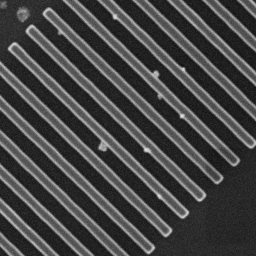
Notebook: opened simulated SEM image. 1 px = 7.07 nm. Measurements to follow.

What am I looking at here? groups of lines, slits or small figures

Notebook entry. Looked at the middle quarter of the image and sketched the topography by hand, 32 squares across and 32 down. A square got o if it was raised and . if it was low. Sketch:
oo......ooo......ooo.....oooo...
ooo......ooo......ooo.....oooo..
.ooo......ooo......ooo.....oooo.
..oooo.....oooo.....ooo......ooo
...oooo.....oooo.....ooo......oo
....oooo.....oooo.....ooo......o
.....oooo.....ooo......ooo......
o.....oooo.....ooo......ooo.....
oo.....oooo.....ooo......ooo....
ooo.....oooo.....oooo.....ooo...
.ooo.....oooo.....oooo.....ooo..
..ooo.....oooo.....oooo.....oooo
...ooo.....oooo.....oooo.....ooo
....ooo.....oooo.....oooo.....oo
.....ooo.....oooo.....oooo.....o
o.....ooo......ooo.....oooo.....
o......ooo......ooo.....oooo....
oo......ooo......ooo.....oooo...
ooo......ooo.....oooo.....oooo..
.oooo.....ooo......ooo.....oooo.
..oooo.....ooo......ooo......ooo
...oooo.....ooo.....oooo.....ooo
....oooo.....ooo......ooo.....oo
.....oooo.....ooo......ooo.....o
o.....oooo.....ooo......ooo.....
oo.....oooo.....ooo......ooo....
ooo.....oooo.....ooo......ooo...
.ooo.....oooo.....oooo.....ooo..
..ooo.....oooo.....oooo.....ooo.
...ooo.....oooo.....oooo.....ooo
....ooo.....oooo.....oooo.....oo
.....ooo.....oooo.....ooo......o